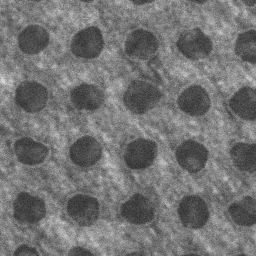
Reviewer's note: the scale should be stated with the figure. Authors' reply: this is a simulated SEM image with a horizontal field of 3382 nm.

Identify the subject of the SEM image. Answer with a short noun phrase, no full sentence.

a regular array of raised bodies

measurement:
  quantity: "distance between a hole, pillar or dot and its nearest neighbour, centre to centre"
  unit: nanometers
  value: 718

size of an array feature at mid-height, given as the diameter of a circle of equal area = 464 nm